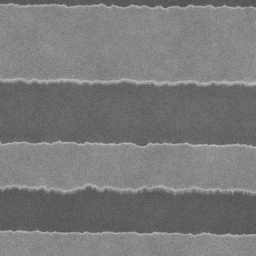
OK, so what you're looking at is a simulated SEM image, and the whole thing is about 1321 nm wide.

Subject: lines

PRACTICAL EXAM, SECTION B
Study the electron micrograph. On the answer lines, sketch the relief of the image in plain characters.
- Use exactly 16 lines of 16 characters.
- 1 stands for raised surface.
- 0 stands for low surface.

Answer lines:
1111111111111111
1111111111111111
1111111111111111
1111111111111111
1111111111111111
0000000000000000
0000000000000000
0000000000000000
0000000000000000
1111111111111111
1111111111111111
1111111111111111
0000000000000000
0000000000000000
1110000000000000
1111111111111111